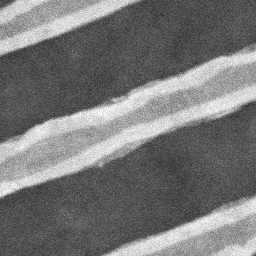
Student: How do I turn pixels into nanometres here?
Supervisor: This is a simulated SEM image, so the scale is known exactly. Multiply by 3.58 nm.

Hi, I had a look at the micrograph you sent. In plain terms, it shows one or a few lines or trenches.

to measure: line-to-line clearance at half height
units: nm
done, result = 371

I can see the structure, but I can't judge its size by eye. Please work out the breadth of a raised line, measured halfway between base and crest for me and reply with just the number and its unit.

36.9 px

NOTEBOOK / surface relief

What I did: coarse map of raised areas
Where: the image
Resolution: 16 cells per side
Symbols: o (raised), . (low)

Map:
.oooooo.........
oooo............
oo..............
................
.............ooo
..........oooooo
........oooooo..
.....oooooo.....
..oooooo........
oooooo..........
oooo............
oo..............
................
..............oo
...........ooooo
.........ooooooo